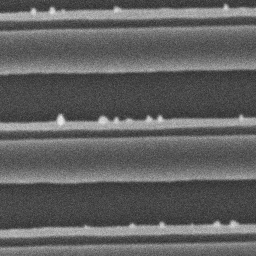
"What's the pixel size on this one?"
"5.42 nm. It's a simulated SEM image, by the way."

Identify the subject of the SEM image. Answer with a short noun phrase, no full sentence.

lines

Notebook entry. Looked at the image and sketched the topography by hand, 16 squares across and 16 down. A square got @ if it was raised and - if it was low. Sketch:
--------------@-
@@@@@@@@@@@@@@@@
@@@@@@@@@@@@@@@@
@@@@@@@@@@@@@@@@
@@@@@@@@--------
----------------
----------------
---@--@--@@@@@@@
@@@@@@@@@@@@@@@@
@@@@@@@@@@@@@@@@
@@@@@@@@@@@@@@@@
----------------
----------------
----------------
@@@@@@@@@@@@@@@@
@@@@@@@@@@@@@@@@